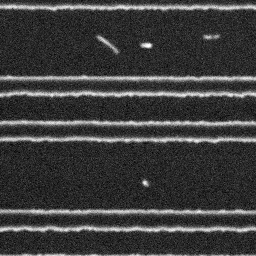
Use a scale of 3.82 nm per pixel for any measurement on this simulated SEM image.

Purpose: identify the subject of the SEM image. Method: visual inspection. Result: lines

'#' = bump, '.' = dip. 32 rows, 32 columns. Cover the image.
################################
................................
................................
................................
................................
................................
................................
................................
................................
................................
################################
################################
................................
................................
................................
################################
################################
#########.######################
................................
................................
................................
................................
................................
................................
................................
................................
################################
################################
################################
................................
................................
................................